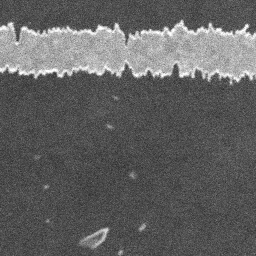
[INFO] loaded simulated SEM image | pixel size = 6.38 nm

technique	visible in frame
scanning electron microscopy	one or a few lines or trenches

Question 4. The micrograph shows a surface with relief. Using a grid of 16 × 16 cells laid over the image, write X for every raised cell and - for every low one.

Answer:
----------------
----------------
XXXXXXXXXXXXXXXX
XXXXXXXXXXXXXXXX
-XXX--X-XXXXXXXX
----------------
----------------
----------------
----------------
----------------
----------------
----------------
----------------
----------------
----------------
----------------